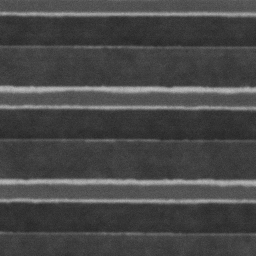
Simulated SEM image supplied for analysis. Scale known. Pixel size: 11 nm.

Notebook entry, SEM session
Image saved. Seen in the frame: lines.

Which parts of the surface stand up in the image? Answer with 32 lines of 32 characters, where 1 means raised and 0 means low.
11111111111111111111111111111111
11111111111111111111111111111111
00000000000000000000000000000000
00000000000000000000000000000000
00000000000000000000000000000000
00000000000000000000000000000000
00000000000000000000000000000000
00000000000000000000000000000000
00000000000000000000000000000000
00000000000000000000000000000000
00000000000000000000000000000000
11111111111111111111111111111111
11111111111111111111111111111111
00000000000000000000000010000111
00000000000000000000000000000000
00000000000000000000000000000000
00000000000000000000000000000000
00000000000000000000000000000000
00000000000000000000000000000000
00000000000000000000000000000000
00000000000000000000000000000000
00000000000000000000000000000000
00001101111100000000000000000000
11111111111111111111111111111111
11111111111111111111111111111111
00000000000000000000000000000000
00000000000000000000000000000000
00000000000000000000000000000000
00000000000000000000000000000000
00000000000000000000000000000000
00000000000000000000000000000000
00000000000000000000000000000000